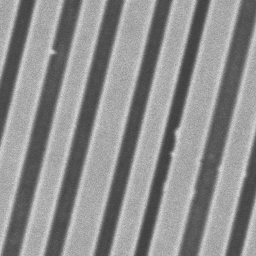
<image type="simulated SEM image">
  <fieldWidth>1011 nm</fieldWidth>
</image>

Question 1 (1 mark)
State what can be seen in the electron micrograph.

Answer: parallel lines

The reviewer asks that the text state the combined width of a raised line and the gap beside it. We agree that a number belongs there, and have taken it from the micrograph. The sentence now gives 170 nm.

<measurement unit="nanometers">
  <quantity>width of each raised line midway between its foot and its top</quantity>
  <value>113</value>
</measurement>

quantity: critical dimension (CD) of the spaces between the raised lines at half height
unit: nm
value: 58